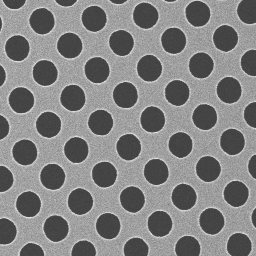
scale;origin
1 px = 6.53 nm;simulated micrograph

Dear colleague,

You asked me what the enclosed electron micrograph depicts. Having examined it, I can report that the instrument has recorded a regular array of holes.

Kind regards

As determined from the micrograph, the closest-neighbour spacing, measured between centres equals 0.237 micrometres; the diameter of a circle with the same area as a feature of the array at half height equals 166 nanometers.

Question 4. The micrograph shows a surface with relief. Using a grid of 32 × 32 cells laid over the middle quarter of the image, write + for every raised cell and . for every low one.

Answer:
+++++......+++++++......+++++++.
+++++......+++++++.......++++++.
+++++......++++++++.....++++++++
++++++.....++++++++.....++++++++
+++++++...+++++++++++++++++...++
+...+++++++++.....++++++++.....+
.....+++++++......+++++++......+
.....+++++++......+++++++......+
.....+++++++......+++++++......+
.....++++++++.....++++++++.....+
.....++++++++....+++++++++++++++
+...+++++.++++++++++....++++++++
+++++++....++++++++......+++++++
++++++......+++++++......+++++++
++++++......+++++++......+++++++
++++++......+++++++......+++++++
+++++++.....++++++++....++++++++
++++++++...+++++.+++++++++++...+
++..++++++++++....+++++++++.....
+.....+++++++......+++++++......
......+++++++......+++++++......
......+++++++......+++++++......
......++++++++.....++++++++....+
+....+++++++++....++++++++++++++
++..++++++.++++++++++....+++++++
++++++++....++++++++......++++++
+++++++......+++++++......++++++
+++++++......+++++++......++++++
+++++++......+++++++......++++++
++++++++.....++++++++....+++++++
+++++++++...++++++++++++++++....
++...++++++++++....++++++++.....